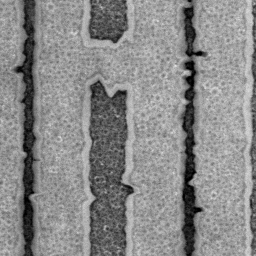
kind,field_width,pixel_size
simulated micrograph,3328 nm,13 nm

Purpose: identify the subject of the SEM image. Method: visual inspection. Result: one or a few lines or trenches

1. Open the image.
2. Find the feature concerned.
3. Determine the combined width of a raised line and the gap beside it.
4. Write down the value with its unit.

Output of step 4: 1040 nanometers